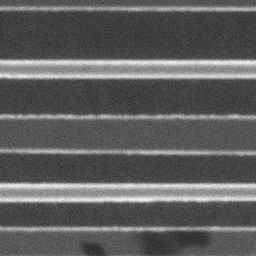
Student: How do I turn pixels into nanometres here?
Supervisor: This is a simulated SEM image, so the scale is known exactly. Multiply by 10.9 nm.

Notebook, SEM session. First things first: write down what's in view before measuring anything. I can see lines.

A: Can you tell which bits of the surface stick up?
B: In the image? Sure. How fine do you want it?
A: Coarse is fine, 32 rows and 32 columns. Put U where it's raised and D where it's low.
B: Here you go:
UUUUUUUUUUUUUUUUUUUUUUUUUUUUUUUU
DDDDDDDDDDDDDDDDDDDDDDDDDDDDDDDD
DDDDDDDDDDDDDDDDDDDDDDDDDDDDDDDD
DDDDDDDDDDDDDDDDDDDDDDDDDDDDDDDD
DDDDDDDDDDDDDDDDDDDDDDDDDDDDDDDD
DDDDDDDDDDDDDDDDDDDDDDDDDDDDDDDD
DDDDDDDDDDDDDDDDDDDDDDDDDDDDDDDD
DDDDDDDDDDDDDDDDDDDDDDDDDDDDDDDD
UUUUUUUUUUUUUUUUUUUUUUUUUUUUUUUU
UUUUUUUUUUUUUUUUUUUUUUUUUUUUUUUU
DDDDDDDDDDDDDDDDDDDDDDDDDDDDDDDD
DDDDDDDDDDDDDDDDDDDDDDDDDDDDDDDD
DDDDDDDDDDDDDDDDDDDDDDDDDDDDDDDD
DDDDDDDDDDDDDDDDDDDDDDDDDDDDDDDD
UUUUUUUUUDDDUUUDDUUUUUUDDDUDUUDD
UUUUUUUUUUUUUUUUUUUUUUUUUUUUUUUU
UUUUUUUUUUUUUUUUUUUUUUUUUUUUUUUU
UUUUUUUUUUUUUUUUUUUUUUUUUUUUUUUU
UUUUUUUUUUUUUUUUUUUUUUUUUUUUUUUU
DDDDDDDDDDDDDDDDDDDDDDDDDDDDDDDD
DDDDDDDDDDDDDDDDDDDDDDDDDDDDDDDD
DDDDDDDDDDDDDDDDDDDDDDDDDDDDDDDD
DDDDDDDDDDDDDDDDDDDDDDDDDDDDDDDD
UUUUUUUUUUUUUUUUUUUUUUUUUUUUUUUU
UUUUUUUUUUUUUUUUUUUUUUUUUUUUUUUU
DDDDDDDDDDDDDDDDDDDDDDDDDDDDDDDD
DDDDDDDDDDDDDDDDDDDDDDDDDDDDDDDD
DDDDDDDDDDDDDDDDDDDDDDDDDDDDDDDD
DDDDDDDDDDDDDDUDDDDDDDDDDDDDDDDD
UUUUUUUUUUUUUUUUUUUUUUUUUUUUUUUU
UUUUUUUUUUUUUUUUUUUUUUUUUUUUUUUU
UUUUUUUUUUUUUUUUUUUUUUUUUUUUUUUU